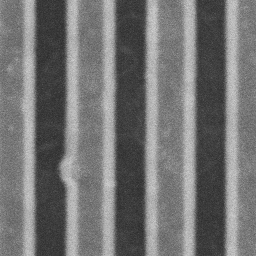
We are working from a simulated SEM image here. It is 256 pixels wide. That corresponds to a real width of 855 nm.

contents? one or a few lines or trenches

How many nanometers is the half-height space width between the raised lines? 134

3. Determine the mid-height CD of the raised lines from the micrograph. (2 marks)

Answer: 134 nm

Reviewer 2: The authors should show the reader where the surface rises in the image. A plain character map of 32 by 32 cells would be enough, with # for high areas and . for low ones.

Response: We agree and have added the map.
####.....#####.....#####.....###
####.....#####.....#####.....###
####.....#####.....#####.....###
####.....#####.....#####.....###
####.....#####.....#####.....###
####.....#####.....#####.....###
####.....#####.....#####.....###
####.....#####.....#####.....###
####.....#####.....#####.....###
####.....#####.....#####.....###
####.....#####.....#####.....###
####.....#####.....#####.....###
####.....#####.....#####.....###
####.....#####.....#####.....###
####.....#####.....#####.....###
####.....#####.....#####.....###
####.....#####.....#####.....###
####.....#####.....#####.....###
####.....#####.....#####.....###
####.....#####.....#####.....###
####....######.....#####.....###
####....######.....#####.....###
####....######.....#####.....###
####.....#####.....#####.....###
####.....#####.....#####.....###
####.....#####.....#####.....###
####.....#####.....#####.....###
####.....#####.....#####.....###
####.....#####.....#####.....###
####.....#####.....#####.....###
####.....#####.....#####.....###
####.....#####.....#####.....###